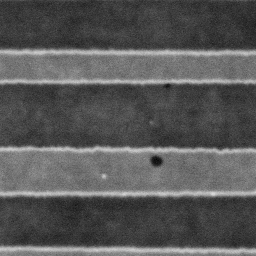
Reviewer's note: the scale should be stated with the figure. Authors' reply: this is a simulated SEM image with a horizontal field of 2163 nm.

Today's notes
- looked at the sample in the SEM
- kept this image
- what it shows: lines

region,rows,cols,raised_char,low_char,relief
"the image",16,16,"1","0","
0000000000000000
0000000000000000
0000000000000000
1111111111111111
1111111111111111
0000000000000000
0000000000000000
0000000000000000
0000000000000000
1111111111111111
1111111111111111
1111111111111111
0000000000000000
0000000000000000
0000000000000000
0000000000000000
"